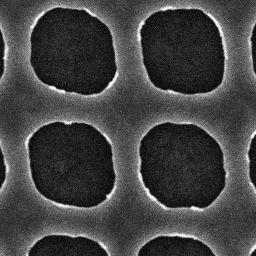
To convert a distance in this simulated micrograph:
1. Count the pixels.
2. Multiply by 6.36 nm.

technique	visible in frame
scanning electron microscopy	holes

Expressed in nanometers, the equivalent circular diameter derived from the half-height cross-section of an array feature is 562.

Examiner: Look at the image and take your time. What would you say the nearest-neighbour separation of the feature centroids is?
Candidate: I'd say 700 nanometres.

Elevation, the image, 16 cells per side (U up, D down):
UUUDUUUUUUUUUUUU
UUDDDDDUUDDDDUUU
UUDDDDDUUDDDDDUU
UUDDDDDUUDDDDDUU
UUDDDDDUUDDDDDUU
UUUDDDDUUUDDDDUU
UUUUUUUUUUUUUUUU
UUUUUUUUUUUUUUUU
UUDDDDUUUDDDDUUU
UUDDDDDUUDDDDDUU
UUDDDDDUUDDDDDUU
UUDDDDDUUDDDDDUU
UUUDDDDUUUDDDUUU
UUUUUUUUUUUUUUUU
UUUUUUUUUUUUUUUU
UUDDDDUUUDDDDUUU